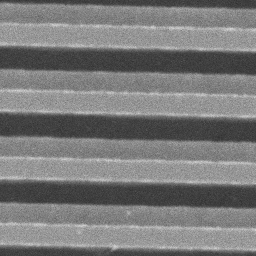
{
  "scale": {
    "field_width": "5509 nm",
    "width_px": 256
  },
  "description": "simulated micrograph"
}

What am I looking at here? lines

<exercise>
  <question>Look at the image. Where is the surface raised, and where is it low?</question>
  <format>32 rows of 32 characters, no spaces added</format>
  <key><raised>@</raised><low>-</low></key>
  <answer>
--------------------------------
@@@@@@@@@@@@@@@@@@@@@@@@@@@@@@@@
@@@@@@@@@@@@@@@@@@@@@@@@@@@@@@@@
@@@@@@@@@@@@@@@@@@@@@@@@@@@@@@@@
@@@@@@@@@@@@@@@@@@@@@@@@@@@@@@@@
@@@@@@@@@@@@@@@@@@@@@@@@@@@@@@@@
--------------------------------
--------------------------------
--------------------------------
@@@@@@@@@@@@@@@@@@@@@@@@@@@@@@@-
@@@@@@@@@@@@@@@@@@@@@@@@@@@@@@@@
@@@@@@@@@@@@@@@@@@@@@@@@@@@@@@@@
@@@@@@@@@@@@@@@@@@@@@@@@@@@@@@@@
@@@@@@@@@@@@@@@@@@@@@@@@@@@@@@@@
------------------------@@@@@@@@
--------------------------------
--------------------------------
@@@@@@@@@@@@@@@-----------------
@@@@@@@@@@@@@@@@@@@@@@@@@@@@@@@@
@@@@@@@@@@@@@@@@@@@@@@@@@@@@@@@@
@@@@@@@@@@@@@@@@@@@@@@@@@@@@@@@@
@@@@@@@@@@@@@@@@@@@@@@@@@@@@@@@@
-----------@@@@@@@@@@@@@@@@@@@@@
--------------------------------
--------------------------------
@@@-----------------------------
@@@@@@@@@@@@@@@@@@@@@@@@@@@@@@@@
@@@@@@@@@@@@@@@@@@@@@@@@@@@@@@@@
@@@@@@@@@@@@@@@@@@@@@@@@@@@@@@@@
@@@@@@@@@@@@@@@@@@@@@@@@@@@@@@@@
@@@@@@@@@@@@@@@@@@@@@@@@@@@@@@@@
--------------------------------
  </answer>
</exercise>